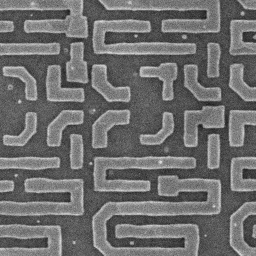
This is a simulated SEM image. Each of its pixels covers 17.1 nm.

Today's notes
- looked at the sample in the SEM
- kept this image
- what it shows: wiring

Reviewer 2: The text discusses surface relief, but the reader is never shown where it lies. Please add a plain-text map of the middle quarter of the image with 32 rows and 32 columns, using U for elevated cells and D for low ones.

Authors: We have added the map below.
DUUUUDDUUUDDDDDDDDDDDDDDUUUUDDUU
DUUUUUDUUUDDDDDDDDDUUUUUUUUUDDUU
DUUUUUDUUUUDDDDDDDDUUUUUUUUUDDUU
DUUUUUDUUUUDDDDDDDDDDDDDUUUUDDUU
DDDDUUDUUUUDDDDDDDDDDDDDDUUDDDUU
DDDDDDDUUUUUDDDDDDDDDDDDDUUDDDUU
UUUUUDDDUUUUUUUUDDDDDDDDDUUDDDDD
UUUUUDDDDUUUUUUUDDDDDDDDDUUDDDDD
UUUUUDDDDDUUUUUUDDDDDDDDDUUDDDDD
DDDDDDDDDDDDDDDDDDDDDDDDDDDDDDDD
DDDDDDDDDDDDDDDDDDDDDDDDDDDDDDDD
DDDDDDDDDDDDDDDDDDDDDDDDDDDDDDDD
UUUUUDDDDDUUUUUUDDDDDDDDDUUDDDUU
UUUUUDDDDUUUUUUUDDDDDDDDDUUDDDUU
UUUUUDDDUUUUUUUUDDDDDDDDDUUDDDUU
UDDDDDDUUUUUDDDDDDDDDDDDDUUDDDUU
DDDDDDDUUUUDDDDDDDDDDDDDUUUDDDUU
DDDDDDDUUUUDDDDDDDDDDDDUUUUDDDUU
DDUUDDDUUUUDDDDDDDDUUUUUUDDDDDUU
DDUUUDDUUUUDDDDDDDDUUUUUUDDDDDUU
DDUUUDDUUUDDDDDDDDDDDDDDDDDDDDDD
DDUUUDDDDDDDDDDDDDDDDDDDDDDDDDDD
DDUUUDDDDDDDDDDDDDDDDDDDDDDDDDDD
DDUUUDDDUUUUDUUUUUDUUUUUUUUUUUUU
DDUUUDDDUUUUUUUUUUUUUUUUUUUUUUUU
DDUUUDDDUUUUUUUUUUUUUUUUUUUUUUUU
DDDDDDDDUUUDDDDDDDDDDDDDDDDDDDDD
DDDDDDDDUUDDDDDDDDDDDDDDDDDDDDDD
DDDDDDDDUUDDDDDDDDDDDDDDUUUUDDDD
UUUUUDDDUUUUUUUUUUUUUDDDUUUUUUUU
UUUUUDDDUUUUUUUUUUUUUDDDUUUUUUUU
UUUUUDDDUUUUUUUUUUUUUDDDUUUUUUUU